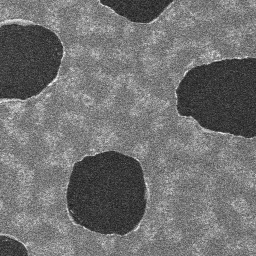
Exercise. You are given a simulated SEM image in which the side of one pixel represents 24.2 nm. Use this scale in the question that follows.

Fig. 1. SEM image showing holes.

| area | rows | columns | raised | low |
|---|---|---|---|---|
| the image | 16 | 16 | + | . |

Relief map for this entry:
+++++++...++++++
..++++++++++++++
....++++++++++++
....++++++++++++
....++++++++....
...++++++++.....
+++++++++++.....
++++++++++++....
+++++++++++++++.
++++++++++++++++
+++++....+++++++
++++.....+++++++
++++.....+++++++
++++.....+++++++
++++++..++++++++
..++++++++++++++